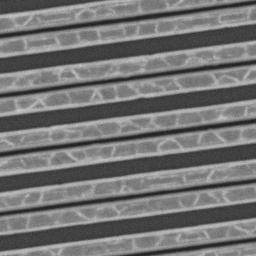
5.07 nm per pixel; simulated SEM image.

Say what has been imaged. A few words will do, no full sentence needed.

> parallel lines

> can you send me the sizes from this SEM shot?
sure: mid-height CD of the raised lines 77.9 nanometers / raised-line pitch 149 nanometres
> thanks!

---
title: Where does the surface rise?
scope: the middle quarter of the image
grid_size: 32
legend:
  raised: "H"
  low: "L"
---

LLLLHHHHHHHHHHHHHHHHHHHHHHHHHHHH
HHHHHHHHHHHHHHHHHHHHHHHHLLLLLLLL
HHHHHHHHHHHHHHHHHLLLLLLLLLLLLLLL
HHHHHHHHHLLLLLLLLLLLLLLLLLHHHHHH
HLLLLLLLLLLLLLLLLLHHHHHHHHHHHHHH
LLLLLLLLLLHHHHHHHHHHHHHHHHHHHHHH
LLLHHHHHHHHHHHHHHHHHHHHHHHHHHHHL
HHHHHHHHHHHHHHHHHHHHHHHLLLLLLLLL
HHHHHHHHHHHHHHHHHLLLLLLLLLLLLLLL
HHHHHHHHLLLLLLLLLLLLLLLLLLLLLLLL
HLLLLLLLLLLLLLLLLLLLLLLLLLLLLLLL
LLLLLLLLLLLLLLLLLLLLLLLLLLLLLLLL
LLLLLLLLLLLLLLLLLLLLLLLLLHHHHHHH
LLLLLLLLLLLLLLLLLHHHHHHHHHHHHHHH
LLLLLLLLLHHHHHHHHHHHHHHHHHHHHHHH
LLHHHHHHHHHHHHHHHHHHHHHHHHHHHHLL
HHHHHHHHHHHHHHHHHHHHHHLLLLLLLLLL
HHHHHHHHHHHHHHHHHLLLLLLLLLLLLLLH
HHHHHHHHHLLLLLLLLLLLLLLLHHHHHHHH
LLLLLLLLLLLLLLLLHHHHHHHHHHHHHHHH
LLLLLLLHHHHHHHHHHHHHHHHHHHHHHHHH
LHHHHHHHHHHHHHHHHHHHHHHHHHHHHHHL
HHHHHHHHHHHHHHHHHHHHHHLLLLLLLLLL
HHHHHHHHHHHHHHLLLLLLLLLLLLLLLLLL
HHHHHHHLLLLLLLLLLLLLLLLLLLLLLLLL
HLLLLLLLLLLLLLLLLLLLLLLLLLLLLLLL
LLLLLLLLLLLLLLLLLLLLLLLLLLLLLLHH
LLLLLLLLLLLLLLLLLLLLLLLHHHHHHHHH
LLLLLLLLLLLLLLLHHHHHHHHHHHHHHHHH
LLLLLLLLHHHHHHHHHHHHHHHHHHHHHHHH
HHHHHHHHHHHHHHHHHHHHHHHHHHHHHHLL
HHHHHHHHHHHHHHHHHHHHHHLLLLLLLLLL